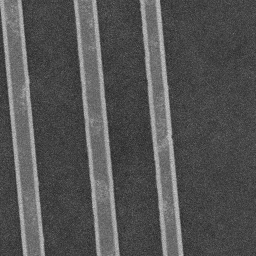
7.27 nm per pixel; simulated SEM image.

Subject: one or a few lines or trenches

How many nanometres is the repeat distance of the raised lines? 504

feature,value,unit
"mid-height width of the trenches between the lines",0.375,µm